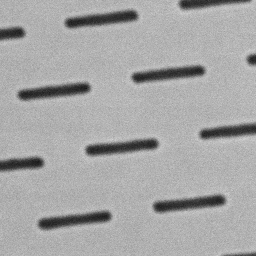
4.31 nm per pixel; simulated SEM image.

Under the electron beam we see holes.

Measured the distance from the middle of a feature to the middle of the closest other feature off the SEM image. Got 374 nm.